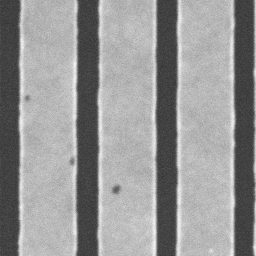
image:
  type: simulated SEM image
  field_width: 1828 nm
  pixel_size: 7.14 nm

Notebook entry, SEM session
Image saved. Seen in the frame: lines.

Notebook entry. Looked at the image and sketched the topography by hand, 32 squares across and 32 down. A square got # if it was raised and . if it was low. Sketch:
...#######..#######...#######...
...#######..#######...#######...
...#######...######...#######...
..########..#######...#######...
...#######..#######...#######...
...#######...######...#######...
...#######...######...#######...
..########...######...#######...
..########..#######...#######...
...#######...######...#######...
...#######...######...#######...
...#######..#######...#######...
...#######..#######...#######...
..########..#######...#######...
..########..#######...#######...
..#######...#######...#######...
..#######...#######...#######...
...#######..#######...#######...
...#######..#######...#######...
...#######..#######...#######...
...#######..#######...#######...
..########..#######...#######...
..#######...#######...#######...
..#######...#######...#######...
..#######...#######...#######...
..#######...#######...#######...
..########..#######...#######...
..########..#######...#######...
...#######..#######...#######...
..########..#######...#######...
..########..#######...#######...
..########..#######...#######...